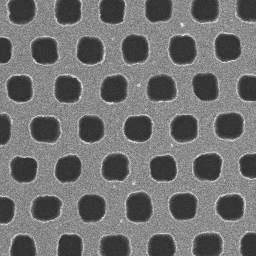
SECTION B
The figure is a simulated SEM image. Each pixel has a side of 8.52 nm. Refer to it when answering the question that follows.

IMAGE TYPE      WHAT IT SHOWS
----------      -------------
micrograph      a regular array of holes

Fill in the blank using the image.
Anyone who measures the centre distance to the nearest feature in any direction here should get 381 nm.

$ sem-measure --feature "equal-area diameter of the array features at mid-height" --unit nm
222